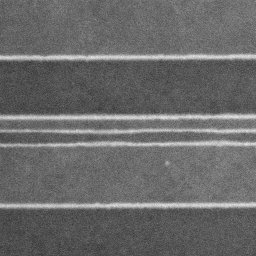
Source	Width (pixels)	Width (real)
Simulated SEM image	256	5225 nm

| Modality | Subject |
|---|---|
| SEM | lines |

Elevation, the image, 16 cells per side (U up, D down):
UUUUUUUUUUUUUUUU
UUUUUUUUUUUUUUUU
UUUUUUUUUUUUUUUU
UUUUUUUDDDDDDDDD
DDDDDDDDDDDDDDDD
DDDDDDDDDDDDDDDD
DDDDDDDDDDDDDDDD
UUUUUUUUUUUUUUUU
UUUUUUUUUUUUUUUU
UUUUUUUUUUUUUUUU
UUUUUUUUUUUUUUUU
UUUUUUUUUUUUUUUU
UUUUUUUUUUUUUUUU
DDDDDDDDDDDDDDDD
DDDDDDDDDDDDDDDD
DDDDDDDDDDDDDDDD